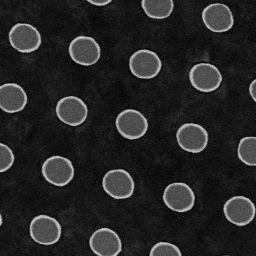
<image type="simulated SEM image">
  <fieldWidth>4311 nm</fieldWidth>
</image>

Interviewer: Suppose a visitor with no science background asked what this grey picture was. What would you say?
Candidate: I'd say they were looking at a regular array of raised bodies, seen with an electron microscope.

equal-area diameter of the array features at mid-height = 0.48 um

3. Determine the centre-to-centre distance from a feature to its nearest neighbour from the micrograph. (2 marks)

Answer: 1030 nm